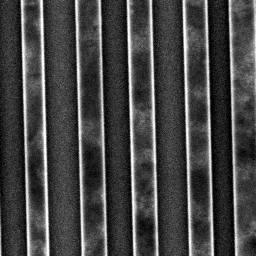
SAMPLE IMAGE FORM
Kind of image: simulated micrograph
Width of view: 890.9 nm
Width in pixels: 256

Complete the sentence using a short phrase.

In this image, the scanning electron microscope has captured parallel lines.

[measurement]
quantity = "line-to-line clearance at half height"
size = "98.4 nm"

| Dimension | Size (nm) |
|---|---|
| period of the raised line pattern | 189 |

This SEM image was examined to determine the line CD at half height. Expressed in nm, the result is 80.1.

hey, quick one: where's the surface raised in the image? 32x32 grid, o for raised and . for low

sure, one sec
...oo.....ooo...ooo....ooo...ooo
...oo.....ooo...ooo....ooo...ooo
...oo.....ooo...ooo....ooo...ooo
...oo.....ooo...ooo....ooo...ooo
...oo.....ooo...ooo....ooo...ooo
...oo.....ooo...ooo....ooo...ooo
...oo.....ooo...ooo....ooo...ooo
...oo.....ooo...ooo....ooo...ooo
...oo.....ooo...ooo....ooo...ooo
...oo.....ooo...ooo....ooo...ooo
...oo.....ooo...ooo....ooo...ooo
...oo.....ooo...ooo....ooo...ooo
...oo.....ooo...ooo....ooo...ooo
...oo.....ooo...ooo....ooo...ooo
...ooo....ooo...ooo....ooo...ooo
...ooo....ooo...ooo....ooo...ooo
...ooo....ooo...ooo....ooo...ooo
...ooo....ooo...ooo....ooo...ooo
...ooo....ooo...ooo....ooo...ooo
...ooo....ooo....oo....ooo...ooo
...ooo....ooo....oo....ooo...ooo
...ooo....ooo....oo....ooo...ooo
...ooo....ooo....oo.....oo...ooo
...ooo....ooo....oo.....oo...ooo
...ooo....ooo....oo.....oo...ooo
...ooo....ooo....oo.....oo...ooo
...ooo....ooo....oo.....oo...ooo
...ooo....ooo....oo.....oo...ooo
....oo....ooo....ooo....oo...ooo
....oo....ooo....ooo....oo...ooo
....oo....ooo....ooo....ooo..ooo
....oo....ooo....ooo....ooo...oo